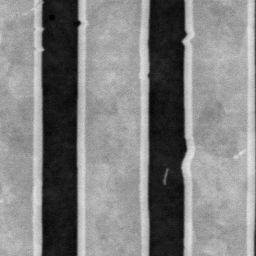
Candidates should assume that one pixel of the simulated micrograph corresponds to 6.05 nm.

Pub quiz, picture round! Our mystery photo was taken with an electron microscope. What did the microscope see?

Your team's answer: one or a few lines or trenches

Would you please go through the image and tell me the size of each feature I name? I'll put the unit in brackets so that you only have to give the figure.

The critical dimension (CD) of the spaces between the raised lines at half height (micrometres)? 0.261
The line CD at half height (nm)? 386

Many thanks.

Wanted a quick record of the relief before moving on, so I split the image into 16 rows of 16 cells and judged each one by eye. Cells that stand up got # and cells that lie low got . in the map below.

##...####...####
##...####...####
##...####...####
##...####...####
##...####...####
##...####...####
##...####...####
##...####...####
##...####...####
##...####...####
##...####...####
##...####...####
##...####...####
##...####...####
##...####...####
##...####...####